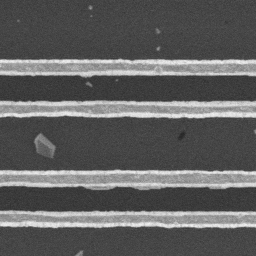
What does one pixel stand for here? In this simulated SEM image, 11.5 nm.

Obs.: lines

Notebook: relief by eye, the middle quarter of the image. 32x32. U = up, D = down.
UUUUUUUUUUUUUUUUUUUUUUUUUUUUUUUU
UUUUUUUUUUUUUUUUUUUUUUUUUUUUUUUU
DDDDDDDDDDDDDDDDDDDDDDDUDDDDDDDD
DDDDDDDDDDDDDDDDDDDDDDDDDDDDDDDD
DDDDDDDDDDDDDDDDDDDDDDDDDDDDDDDD
DDDDDDDDDDDDDDDDDDDDDDDDDDDDDDDD
DDDDDDDDDDDDDDDDDDDDDDDDDDDDDDDD
DDDDDDDDDDDDDDDDDDDDDDDDDDDDDDDD
DDDDDDDDDDDDDDDDDDDDDDDDDDDDDDDD
DDDDDDDDDDDDDDDDDDDDDDDDDDDDDDDD
UUUUUUUUUUUUUUUUUUUUUUUUUUUUUUUU
UUUUUUUUUUUUUUUUUUUUUUUUUUUUUUUU
DDDDUUUUUUUUUUUUDUUUUUUUUUUUUUUU
DDDDDDDDDDDDDDDDDDDDDDDDDDDDDDDD
DDDDDDDDDDDDDDDDDDDDDDDDDDDDDDDD
DDDDDDDDDDDDDDDDDDDDDDDDDDDDDDDD
DDDDDDDDDDDDDDDDDDDDDDDDDDDDDDDD
DDDDDDDDDDDDDDDDDDDDDDDDDDDDDDDD
DDDDDDDDDDDDDDDDDDDDDDDDDDDDDDDD
DDDDDDDDDDDDDDDDDDDDDDDDDDDDDDDD
DDDDDDDDDDDDDDDDDDDDDDDDDDDDDDDD
DDDDDDDDDDDDDDDDDDDDDDDDDDDDDDDD
DDDDDDDDDDDDDDDDDDDDDDDDDDDDDDDD
DDDDDDDDDDDDDDDDDDDDDDDDDDDDDDDD
DDDDDDDDDDDDDDDDDDDDDDDDDDDDDDDD
DDDDDDDDDDDDDDDDDDDDDDDDDDDDDDDD
DDDDDDDDDDDDDDDDDDDDDDDDDDDDDDDD
UUUUUUUUUUUUUUUUUUUUUUUUUUUUUUUU
UUUUUUUUUUUUUUUUUUUUUUUUUUUUUUUU
UUUUUUUUUUUUUUUUUUUUUUUUUUUUUUUU
DDDDDDDDDDDDDDDDDDDDDDDDDDDDDDDD
DDDDDDDDDDDDDDDDDDDDDDDDDDDDDDDD